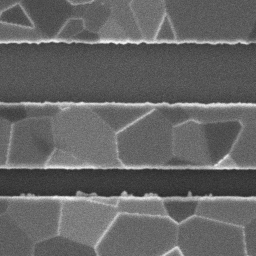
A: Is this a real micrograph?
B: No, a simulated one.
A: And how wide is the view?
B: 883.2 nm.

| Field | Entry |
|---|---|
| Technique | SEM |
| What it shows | lines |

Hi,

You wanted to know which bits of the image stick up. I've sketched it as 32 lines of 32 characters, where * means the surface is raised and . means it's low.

********************************
********************************
********************************
********************************
********************************
................................
................................
................................
................................
................................
................................
................................
................................
********************************
********************************
********************************
********************************
********************************
********************************
********************************
********************************
................................
................................
................................
................................
********************************
********************************
********************************
********************************
********************************
********************************
********************************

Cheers